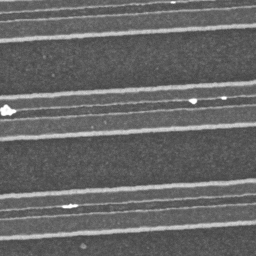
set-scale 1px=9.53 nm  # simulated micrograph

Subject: lines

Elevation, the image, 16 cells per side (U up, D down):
UUUUUUUUUUUUUUUU
UUUUUUUUUUUUUUUU
DDDDDDDDDDDDDDDD
DDDDDDDDDDDDDDDD
DDDDDDDDDDDDDDDD
DDDDDDDDDDDUUUUU
UUUUUUUUUUUUUUUU
UUUUUUUUUUUUUUUU
UUUDDDDDDDDDDDDD
DDDDDDDDDDDDDDDD
DDDDDDDDDDDDDDDD
DDDDDDDDDDDDDUUU
UUUUUUUUUUUUUUUU
UUUUUUUUUUUUUUUU
UUUUUUDDDDDDDDDD
DDDDDDDDDDDDDDDD